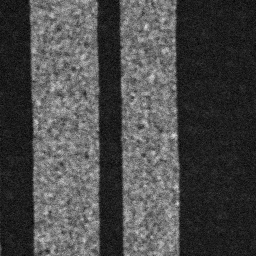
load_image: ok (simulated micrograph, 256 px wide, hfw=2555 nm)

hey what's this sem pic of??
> one or a few lines or trenches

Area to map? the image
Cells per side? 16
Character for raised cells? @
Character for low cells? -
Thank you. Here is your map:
--@@@@--@@@-----
--@@@@--@@@-----
--@@@@--@@@-----
--@@@@--@@@-----
--@@@@--@@@-----
--@@@@--@@@-----
--@@@@--@@@-----
--@@@@--@@@-----
--@@@@--@@@-----
--@@@@--@@@-----
--@@@@--@@@-----
--@@@@--@@@-----
--@@@@--@@@-----
--@@@@--@@@-----
--@@@@--@@@-----
--@@@@--@@@-----